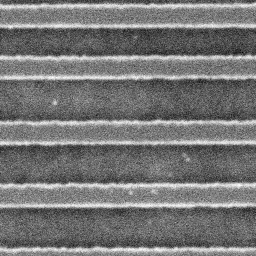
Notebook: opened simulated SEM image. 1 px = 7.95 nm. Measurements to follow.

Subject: lines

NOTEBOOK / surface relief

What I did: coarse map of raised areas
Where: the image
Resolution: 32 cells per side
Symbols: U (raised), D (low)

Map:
DDDDDDDDDDDDDDDDDDDDDDDDDDDDDDDU
UUUUUUUUUUUUUUUUUUUUUUUUUUUUUUUU
UUUUUUUUUUUUUUUUUUUUUUUUUUUUUUUU
DDDDDDDDDDDDDDDDDDDDDDDDDDDDDDDD
DDDDDDDDDDDDDDDDDDDDDDDDDDDDDDDD
DDDDDDDDDDDDDDDDDDDDDDDDDDDDDDDD
DDDDDDDDDDDDDDDDDDDDDDDDDDDDDDDD
UUUUUUUUUUUUUUUUUUUUUUUUUUUUUUUU
UUUUUUUUUUUUUUUUUUUUUUUUUUUUUUUU
UUUUUUUUUUUUUUUUUUUUUUUUUUUUUUUU
DDDDDDDDDDDDDDDDDDDDDDDDDDDDDDDD
DDDDDDDDDDDDDDDDDDDDDDDDDDDDDDDD
DDDDDDDDDDDDDDDDDDDDDDDDDDDDDDDD
DDDDDDDDDDDDDDDDDDDDDDDDDDDDDDDD
DDDDDDDDDDDDDDDDDDDDDDDDDDDDDDDD
UUUUUUUUUUUUUUUUUUUUUUUUUUUUUUUU
UUUUUUUUUUUUUUUUUUUUUUUUUUUUUUUU
UUUUUUUUUUUUUUUUUUUUUUUUUUUUUUUU
DDDDDDDDDDDDDDDDDDDDDDDDDDDDDDDD
DDDDDDDDDDDDDDDDDDDDDDDDDDDDDDDD
DDDDDDDDDDDDDDDDDDDDDDDDDDDDDDDD
DDDDDDDDDDDDDDDDDDDDDDDDDDDDDDDD
DDDDDDDDDDDDDDDDDDDDDDDDDDDDDDDD
UUUUUUUUUUUUUUUUUUUUUUUUUUUUUUUU
UUUUUUUUUUUUUUUUUUUUUUUUUUUUUUUU
UUUUUUUUUUUUUUUUUUUUUUUUUUUUUUUU
DDDDDDDDDDDDDDDDDDDDDDDDDDDDDDDD
DDDDDDDDDDDDDDDDDDDDDDDDDDDDDDDD
DDDDDDDDDDDDDDDDDDDDDDDDDDDDDDDD
DDDDDDDDDDDDDDDDDDDDDDDDDDDDDDDD
DDDDDDDDDDDDDDDDDDDDDDDDDDDDDDDD
UUUUUUUUUUUUUUUUUUUUUUUUUUUUUUUU